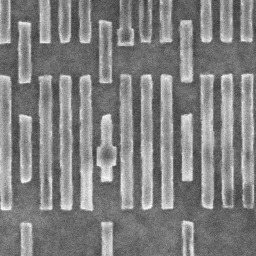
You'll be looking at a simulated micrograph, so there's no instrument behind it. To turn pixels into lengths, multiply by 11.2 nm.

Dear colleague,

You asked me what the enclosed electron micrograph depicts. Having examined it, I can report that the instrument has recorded wiring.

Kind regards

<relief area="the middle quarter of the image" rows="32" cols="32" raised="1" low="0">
00000000011100000000000000000011
00000000011100000000000000000011
00000000011100000000000000000011
10001100011100111000110001100011
10001110001000011000110011100000
10001110000000111000110011100000
10001110000000111000110011100000
10001110000000111000110011100000
10001100000000111000110011100000
10001110000000111000110001100000
10001110000000111000110001100000
10001110000000111000110001100000
11001110000000111000110001100000
11001110001000111000110001100011
10001110001100111000110011100011
10001110001100111000110011100011
11001110001100111000110011100011
11001110001100111000110011100011
11001110001100111000110001100011
11001110001100111000110001100011
11001110011100111000110001100011
11001110111110111000110011100011
11001110111110111000110011100011
11001110111110111000110011100011
11001110111110111000110011100011
11001110011100011000110001100011
11001110001100011000110001100011
11001110001100111000110001100011
11000110001100111000110001100011
11000110000000111000110001100000
11000110000000111000110001100000
11000110000000111000110001100000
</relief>